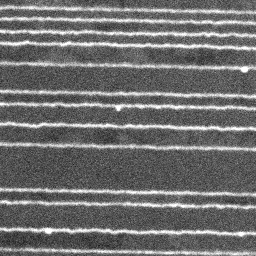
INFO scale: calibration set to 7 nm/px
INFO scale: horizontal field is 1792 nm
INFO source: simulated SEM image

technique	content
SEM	lines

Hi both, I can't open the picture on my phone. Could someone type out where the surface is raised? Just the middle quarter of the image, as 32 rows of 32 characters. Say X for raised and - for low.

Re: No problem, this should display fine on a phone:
------------X---XXXXXXXXXXXXXXXX
--------------------------------
--------------------------------
--------------------------------
--------------------------------
--------------------------------
--------------------------------
XXXXXXXXXXXXXXXXXXXXXXXXXXXX----
XXXXXXXXXXXXXXXXXXXXXXXXXXXXXXXX
XXXXXXXXXXXXXXXXXXXXXXXXXXXXXXXX
----------X-XXXXXXXXXXXXXXXXXXXX
-------------X------------------
--------------------------------
--------------------------------
--------------------------------
XXXXXXXXXXXX----X---------------
XXXXXXXXXXXXXXXXXXXXXXXXXXXXXXXX
XXXXXXXXXXXXXXXXXXXXXXXXXXXXXXXX
XXXXXXXXXXXXXXXXXXXXXXXXXXXXXXXX
XXXXXXXXXXXXXXXXXXXXXXXXXXXXXXXX
X--XXXXXXXXXXXXXXXXXXXXXXXXXXXXX
--------------------------------
--------------------------------
--------------------------------
--------------------------------
--------------------------------
--------------------------------
--------------------------------
--------------------------------
--------------------------------
--------------------------------
--------------------------------